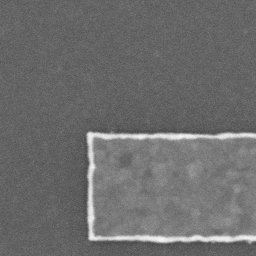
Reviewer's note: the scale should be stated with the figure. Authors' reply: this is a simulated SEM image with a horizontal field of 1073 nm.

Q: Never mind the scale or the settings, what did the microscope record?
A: one or a few lines or trenches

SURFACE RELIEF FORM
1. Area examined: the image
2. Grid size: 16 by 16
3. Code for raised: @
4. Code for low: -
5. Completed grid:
----------------
----------------
----------------
----------------
----------------
----------------
----------------
----------------
------@@@@-@@-@@
------@@@@@@@@@@
------@@@@@@@@@@
------@@@@@@@@@@
------@@@@@@@@@@
------@@@@@@@@@@
------@@@@@@@@@@
----------------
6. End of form